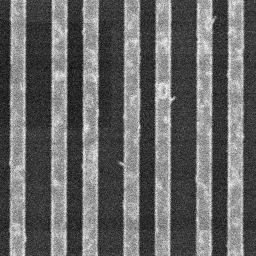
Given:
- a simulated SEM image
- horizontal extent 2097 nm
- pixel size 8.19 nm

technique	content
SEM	parallel lines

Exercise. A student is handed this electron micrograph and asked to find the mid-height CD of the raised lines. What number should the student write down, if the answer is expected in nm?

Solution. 118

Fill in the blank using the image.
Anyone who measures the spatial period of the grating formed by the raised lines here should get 0.297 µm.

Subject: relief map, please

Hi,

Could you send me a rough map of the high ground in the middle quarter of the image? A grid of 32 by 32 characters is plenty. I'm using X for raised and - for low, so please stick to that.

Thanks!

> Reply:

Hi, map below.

-----XXX-------XXXX----XXX------
-----XXX-------XXXX----XXX------
-----XXX-------XXXX----XXXX-----
-----XXX-------XXXX----XXX------
-----XXX-------XXXX----XXX------
-----XXX-------XXXX----XXX------
-----XXX-------XXXX----XXX------
-----XXX-------XXXX----XXX------
-----XXX-------XXXX----XXXX-----
-----XXX-------XXXX----XXXX-----
-----XXX-------XXXX----XXXX-----
-----XXXX------XXXX----XXXX-----
-----XXXX------XXXX----XXXX-----
-----XXX-------XXXX----XXX------
-----XXX-------XXXX----XXXX-----
-----XXX-------XXXX----XXXX-----
-----XXX-------XXXX----XXX------
-----XXX-------XXXX----XXX------
-----XXX-------XXXX----XXX------
-----XXX-------XXXX----XXX------
X----XXX-------XXXX----XXX------
-----XXX-------XXXX----XXX------
-----XXX-------XXXX----XXX------
-----XXX-------XXXX----XXX------
-----XXX-------XXXX----XXX------
-----XXX-------XXXX----XXX------
-----XXX-------XXXX----XXX------
-----XXX-------XXXX----XXX------
-----XXX-------XXXX----XXX------
-----XXX-------XXXX----XXX------
-----XXX-------XXXX----XXX------
-----XXX-------XXXX----XXX------